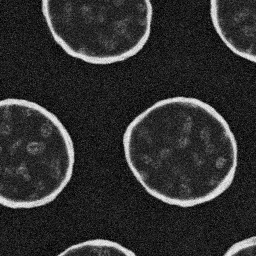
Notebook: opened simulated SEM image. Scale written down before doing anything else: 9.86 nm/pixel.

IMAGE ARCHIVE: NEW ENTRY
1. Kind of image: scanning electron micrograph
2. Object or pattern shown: raised bodies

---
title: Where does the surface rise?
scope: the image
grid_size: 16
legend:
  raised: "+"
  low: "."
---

...++++++....+++
...++++++....+++
....+++++.....++
.....+++.......+
................
................
++........+++...
+++......+++++..
++++....++++++..
++++....+++++++.
++++....+++++++.
++++.....+++++..
+++........++...
................
................
....+++........+